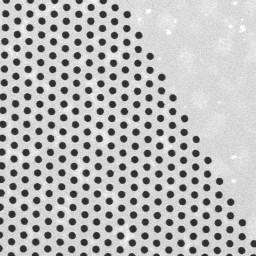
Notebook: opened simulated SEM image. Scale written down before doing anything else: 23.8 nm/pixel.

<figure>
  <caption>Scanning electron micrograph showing a regular array of holes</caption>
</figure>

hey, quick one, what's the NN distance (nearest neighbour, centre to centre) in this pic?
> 0.323 microns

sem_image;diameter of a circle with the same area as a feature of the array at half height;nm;186